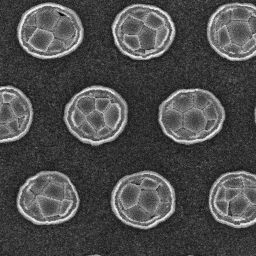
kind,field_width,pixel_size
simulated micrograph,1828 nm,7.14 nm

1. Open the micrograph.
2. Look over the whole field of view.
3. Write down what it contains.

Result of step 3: raised bodies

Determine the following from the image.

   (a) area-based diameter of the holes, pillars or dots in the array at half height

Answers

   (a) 420 nanometers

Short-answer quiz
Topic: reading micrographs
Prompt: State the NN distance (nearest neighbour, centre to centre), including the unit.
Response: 0.678 micrometres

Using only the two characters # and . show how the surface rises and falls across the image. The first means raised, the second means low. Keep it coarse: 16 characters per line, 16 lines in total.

..##....##....##
.####..####..###
.####..####..###
..##....##....##
................
#...............
##..####..####..
##..####..####..
#....##....##...
................
................
..##...####..###
.####..####..###
..##...###...###
................
................